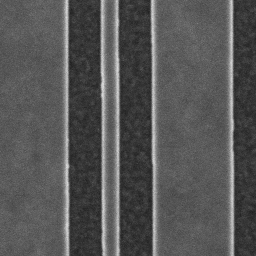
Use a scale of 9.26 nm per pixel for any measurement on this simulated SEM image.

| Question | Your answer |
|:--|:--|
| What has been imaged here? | lines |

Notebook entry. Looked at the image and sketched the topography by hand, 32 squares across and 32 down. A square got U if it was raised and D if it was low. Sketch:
UUUUUUUUDDDDDUUDDDDUUUUUUUUUUDDD
UUUUUUUUDDDDDUUDDDDUUUUUUUUUUDDD
UUUUUUUUDDDDDUUDDDDUUUUUUUUUUDDD
UUUUUUUUDDDDDUUDDDDUUUUUUUUUUDDD
UUUUUUUUDDDDDUUDDDDUUUUUUUUUUDDD
UUUUUUUUDDDDDUUDDDDUUUUUUUUUUDDD
UUUUUUUUDDDDDUUDDDDUUUUUUUUUUDDD
UUUUUUUUDDDDDUUDDDDUUUUUUUUUUDDD
UUUUUUUUDDDDDUUDDDDUUUUUUUUUUDDD
UUUUUUUUDDDDDUUDDDDUUUUUUUUUUDDD
UUUUUUUUDDDDDUUDDDDUUUUUUUUUUDDD
UUUUUUUUDDDDDUUDDDDUUUUUUUUUUDDD
UUUUUUUUDDDDDUUDDDDUUUUUUUUUUDDD
UUUUUUUUDDDDDUUDDDDUUUUUUUUUUDDD
UUUUUUUUDDDDDUUDDDDUUUUUUUUUUDDD
UUUUUUUUDDDDDUUDDDDUUUUUUUUUUDDD
UUUUUUUUDDDDDUUDDDDUUUUUUUUUUDDD
UUUUUUUUDDDDDUUDDDDUUUUUUUUUUDDD
UUUUUUUUDDDDDUUDDDDUUUUUUUUUUDDD
UUUUUUUUDDDDDUUDDDDUUUUUUUUUUDDD
UUUUUUUUDDDDDUUDDDDUUUUUUUUUUDDD
UUUUUUUUDDDDDUUDDDDUUUUUUUUUUDDD
UUUUUUUUDDDDDUUDDDDUUUUUUUUUUDDD
UUUUUUUUDDDDDUUDDDDUUUUUUUUUUDDD
UUUUUUUUUDDDDUUDDDDUUUUUUUUUUDDD
UUUUUUUUUDDDDUUDDDDUUUUUUUUUUDDD
UUUUUUUUDDDDDUUDDDDUUUUUUUUUUDDD
UUUUUUUUUDDDDUUDDDDUUUUUUUUUUDDD
UUUUUUUUDDDDDUUDDDDUUUUUUUUUUDDD
UUUUUUUUUDDDDUUDDDDUUUUUUUUUUDDD
UUUUUUUUUDDDDUUDDDDUUUUUUUUUUDDD
UUUUUUUUUDDDDUUDDDDUUUUUUUUUUDDD